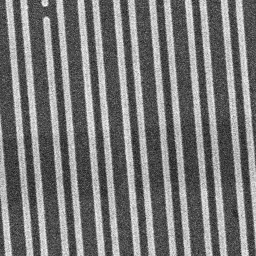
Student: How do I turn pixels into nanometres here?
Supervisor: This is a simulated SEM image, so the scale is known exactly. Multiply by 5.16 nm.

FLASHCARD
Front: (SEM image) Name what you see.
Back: parallel lines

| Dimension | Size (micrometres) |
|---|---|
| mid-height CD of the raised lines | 0.0289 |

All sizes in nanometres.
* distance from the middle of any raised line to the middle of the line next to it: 91.6